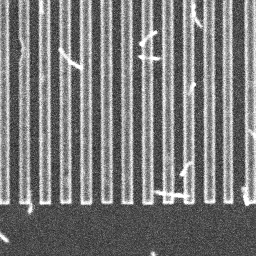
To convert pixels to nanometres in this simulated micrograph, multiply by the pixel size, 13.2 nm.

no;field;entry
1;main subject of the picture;parallel lines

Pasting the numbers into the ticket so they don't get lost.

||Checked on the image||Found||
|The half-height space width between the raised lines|145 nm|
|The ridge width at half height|134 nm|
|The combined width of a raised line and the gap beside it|271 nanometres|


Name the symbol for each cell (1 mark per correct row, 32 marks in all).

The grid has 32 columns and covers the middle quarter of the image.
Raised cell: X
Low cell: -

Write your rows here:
X---XXX---XX---XX---XX---XX---XX
X---XXX---XX---XX---XX---XX---XX
X---XXX---XX---XX---XX---XX---XX
X---XXX---XX---XX---XX---XX---XX
X---XXX---XX---XX---XX---XX---XX
X---XXX---XX---XX---XX---XX---XX
X---XXX---XX---XX---XX---XX---XX
X---XXX---XX---XX---XX---XX---XX
X----XX---XX---XX---XX---XX---XX
X----XX---XX---XX---XX---XX---XX
X----XX---XX---XX---XX---XX---XX
X---XXX---XX---XX---XX---XX---XX
X---XXX---XX---XX---XX---XX---XX
X---XXX---XX---XX---XX---XX---XX
XX--XXX---XX---XX---XX---XX---XX
XX--XXX---XX---XX---XX---XX---XX
XX--XXX---XX---XX---XX---XX---XX
XX--XXX---XX---XX---XX---XX---XX
XX--XXX---XX---XX---XX---XX---XX
XX--XXX---XX---XX---XX---XX---XX
XX--XXX---XX---XX---XX---XX---XX
XX---XX---XX---XX---XX---XX---XX
XX--XXX---XX---XX---XX---XX---XX
XX--XXX---XX---XX---XX---XX---XX
XX--XXX---XX---XX---XX---XX---XX
XX--XXX---XX---XX---XX---XX---XX
XX--XXX---XX---XX---XX---XX---XX
XX--XXX---XX---XX---XX---XX---XX
XX--XXX---XX---XX---XX---XX---XX
XX---XX---XX---XX---XX---XX---XX
XX---XX---XX---XX---XX---XX---XX
XX---XX---XX---XX---XX---XX---XX